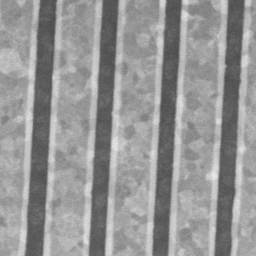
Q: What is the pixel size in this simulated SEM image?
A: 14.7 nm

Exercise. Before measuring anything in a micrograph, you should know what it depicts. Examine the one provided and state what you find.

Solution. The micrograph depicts one or a few lines or trenches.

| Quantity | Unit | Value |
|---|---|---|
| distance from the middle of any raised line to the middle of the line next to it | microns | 0.921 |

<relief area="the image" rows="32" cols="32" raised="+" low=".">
+++++..+++++...+++++...+++++...+
++++...+++++...+++++...+++++...+
++++...+++++...+++++...+++++...+
++++...+++++...+++++...+++++...+
++++...+++++...+++++...+++++...+
++++...+++++...+++++...+++++...+
++++...+++++...+++++...+++++...+
++++...+++++...+++++...+++++...+
++++...+++++...+++++...+++++..++
++++...+++++...+++++...+++++..++
++++...+++++...+++++...+++++..++
++++...+++++...+++++..++++++..++
++++...+++++...+++++..+++++...++
++++...+++++...+++++..+++++...++
++++...+++++..++++++..+++++...++
++++...+++++..+++++...+++++...++
++++...+++++..+++++...+++++...++
++++...++++...+++++...+++++...++
++++..+++++...+++++...+++++...++
+++...+++++...+++++...+++++...++
+++...+++++...+++++...+++++...++
+++...+++++...+++++...+++++...++
+++...+++++...+++++...+++++...++
+++...+++++...+++++...+++++...++
+++...+++++...+++++...+++++...++
+++...+++++...+++++...+++++...++
+++...+++++...+++++...+++++...++
+++...+++++...+++++...+++++..+++
+++...+++++...+++++...+++++..+++
+++...+++++...+++++...+++++..+++
+++...+++++...+++++..+++++...+++
+++...+++++...+++++..+++++...+++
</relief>